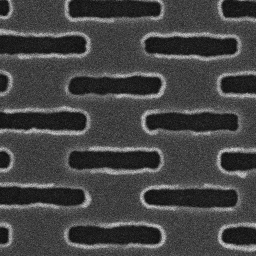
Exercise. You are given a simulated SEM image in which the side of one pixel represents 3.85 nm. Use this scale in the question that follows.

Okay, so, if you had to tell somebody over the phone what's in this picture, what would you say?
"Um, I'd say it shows holes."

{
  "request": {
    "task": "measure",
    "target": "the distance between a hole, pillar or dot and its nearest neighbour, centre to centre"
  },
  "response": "290 nanometers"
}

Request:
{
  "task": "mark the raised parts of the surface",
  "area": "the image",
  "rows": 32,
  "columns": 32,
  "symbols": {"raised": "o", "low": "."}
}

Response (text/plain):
.oooooooo...........oooooooo....
.oooooooo...........oooooooo....
oooooooooooooooooooooooooooooooo
oooooooooooooooooooooooooooooooo
...ooooo..oooooooooooooooooooooo
...........ooooooo............oo
..........oooooooo...........ooo
oooooooooooooooooooooooooooooooo
oooooooooooooooooooooooooooooooo
.ooooooooo.oooooo.ooooooooooo...
.oooooooo...........oooooooo....
ooooooooo...........oooooooo....
oooooooooooooooooooooooooooooooo
oooooooooooooooooooooooooooooooo
...........oooooooo...........oo
...........ooooooo............oo
oooooooooooooooooooooooooooooooo
oooooooooooooooooooooooooooooooo
oooooooooooooooooooooooooooooooo
.oooooooo...........oooooooo....
.oooooooo...........oooooooo....
oooooooooooooooooooooooooooooooo
oooooooooooooooooooooooooooooooo
.........ooooooooooooooooooooooo
...........ooooooo............oo
....ooo...ooooooooo..........ooo
oooooooooooooooooooooooooooooooo
oooooooooooooooooooooooooooooooo
.oooooooo....o.....oooooooooo...
.oooooooo...........oooooooo....
oooooooooo......oo..ooooooooo...
oooooooooooooooooooooooooooooooo